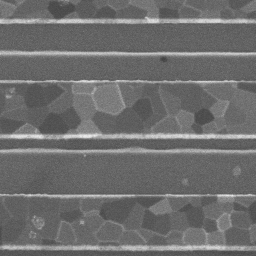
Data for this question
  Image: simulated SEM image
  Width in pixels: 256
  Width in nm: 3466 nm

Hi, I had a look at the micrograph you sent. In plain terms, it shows lines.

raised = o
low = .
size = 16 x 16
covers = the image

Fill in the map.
oooooooooooooooo
................
................
................
................
oooooooooooooooo
oooooooooooooooo
oooooooooooooooo
oooooooooooooooo
................
................
................
oooooooooooooooo
oooooooooooooooo
oooooooooooooooo
oooooooooooooooo